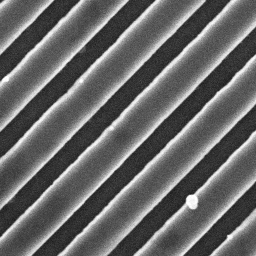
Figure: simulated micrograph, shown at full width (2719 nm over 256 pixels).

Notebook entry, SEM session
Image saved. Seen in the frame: lines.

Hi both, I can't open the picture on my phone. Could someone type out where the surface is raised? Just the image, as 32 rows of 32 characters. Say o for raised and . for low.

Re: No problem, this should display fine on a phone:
oooooo....oooooo...oooooo....ooo
ooooo....oooooo...oooooo....oooo
oooo....oooooo...oooooo....ooooo
ooo....oooooo...oooooo....oooooo
oo....oooooo...oooooo....oooooo.
o....oooooo...oooooo....oooooo..
....oooooo...oooooo....oooooo...
...oooooo...oooooo....oooooo...o
..oooooo...oooooo....oooooo...oo
.oooooo...oooooo....oooooo...ooo
oooooo....ooooo....oooooo....ooo
ooooo....ooooo....oooooo...ooooo
oooo...oooooo....oooooo...oooooo
ooo...oooooo....oooooo...oooooo.
oo...oooooo....oooooo....ooooo..
o...oooooo....oooooo....ooooo...
...oooooo....oooooo....ooooo....
...oooooo...oooooo....ooooo....o
..oooooo...oooooo....ooooo....oo
.oooooo...oooooo....ooooo....ooo
oooooo...oooooo....ooooo....oooo
ooooo...oooooo....ooooo....ooooo
oooo...oooooo....ooooo....oooooo
ooo...oooooo....oooooo...oooooo.
oo...oooooo....oooooo...oooooo..
o...oooooo....oooooo...oooooo...
...oooooo....oooooo...oooooo....
..oooooo....oooooo...oooooo....o
.oooooo....oooooo...oooooo....oo
oooooo....oooooo...oooooo....ooo
ooooo....oooooo...oooooo....oooo
oooo....oooooo...oooooo....ooooo